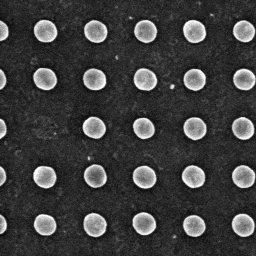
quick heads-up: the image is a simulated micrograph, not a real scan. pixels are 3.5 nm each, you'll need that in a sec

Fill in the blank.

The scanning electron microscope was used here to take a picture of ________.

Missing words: a regular array of raised bodies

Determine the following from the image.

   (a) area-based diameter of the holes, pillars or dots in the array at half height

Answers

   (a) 77.6 nm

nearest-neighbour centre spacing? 0.169 um